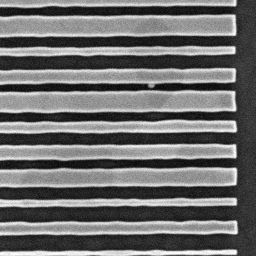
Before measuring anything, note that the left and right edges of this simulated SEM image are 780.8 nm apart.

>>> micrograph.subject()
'groups of lines, slits or small figures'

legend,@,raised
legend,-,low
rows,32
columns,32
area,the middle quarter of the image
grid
--------------------------------
----------@@@-@@@@@@@@--@@@@@-@@
@@@@@@@@@@@@@@@@@@@@@@@@@@@@@@@@
@@@@@@@@@@@@@@@@@@@@@@@@@@@@@@@@
@@@@@@@@@@@@@@@@@@@@@@@@@@@@@@@@
--------------------------------
--------------------------------
@@@@@@@@@@@@@@@@@@@@@@@@@@@@@@@@
@@@@@@@@@@@@@@@@@@@@@@@@@@@@@@@@
@@@@@@@@@@@@@@@@@@@@@@@@@@@@@@@@
@@@@@@@@@@@@@@@@@@@@@@@@@@@@@@@@
@@@@@@@@@@@@@@@@@@@@@@@@@@@@@@@@
--------------------------------
--------------------------------
------------------------@@@@@@@@
@@@@@@@@@@@@@@@@@@@@@@@@@@@@@@@@
@@@@@@@@@@@@@@@@@@@@@@@@@@@@@@@@
--------------------------------
--------------------------------
--------------------------------
----------@@@---------@@@@@@@@@@
@@@@@@@@@@@@@@@@@@@@@@@@@@@@@@@@
@@@@@@@@@@@@@@@@@@@@@@@@@@@@@@@@
@@@@@@@@----@@@@@@@@@@----------
--------------------------------
--------------------------------
@@------------@@@@@@@@@--@@@@@@@
@@@@@@@@@@@@@@@@@@@@@@@@@@@@@@@@
@@@@@@@@@@@@@@@@@@@@@@@@@@@@@@@@
@@@@@@@@@@@@@@@@@@@@@@@@@@@@@@@@
--------------------------------
--------------------------------